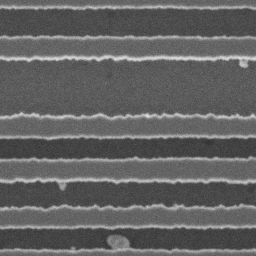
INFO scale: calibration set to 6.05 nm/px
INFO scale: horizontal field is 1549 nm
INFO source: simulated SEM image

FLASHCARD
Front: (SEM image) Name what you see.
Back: lines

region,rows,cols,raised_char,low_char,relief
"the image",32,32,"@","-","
@@@@@@@@@@@@@@@@@@@@@@@@@@@@@@@@
--------------------------------
--------------------------------
--------------------------------
--------------------------------
@@@@@@@@@@@@@@@@@@@@@@@@@@@@@@@@
@@@@@@@@@@@@@@@@@@@@@@@@@@@@@@@@
---@------------@---------------
--------------------------------
--------------------------------
--------------------------------
--------------------------------
--------------------------------
--------------------------------
-@@@@---@---@---@@@@@@@@@@@--@-@
@@@@@@@@@@@@@@@@@@@@@@@@@@@@@@@@
@@@@@@@@@@@@@@@@@@@@@@@@@@@@@@@@
--------------------------------
--------------------------------
--------------------------------
@@@@@@@@@@@@@@@@@@@@@@@@@@@@@@@@
@@@@@@@@@@@@@@@@@@@@@@@@@@@@@@@@
@@@@@@@@@@@@@@@@@@@@@@@@@@@@@@@@
--------------------------------
--------------------------------
--------------------------------
@@@@@@@@@@@@@@@@@@@@@@@@@@@@@@@@
@@@@@@@@@@@@@@@@@@@@@@@@@@@@@@@@
@@@@@@@@@@-@-@@@@@--@@-@@@@@@@@-
--------------------------------
--------------------------------
@@@@@@@@@@@@@@@@@@@@@@@@@@@@@@@@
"